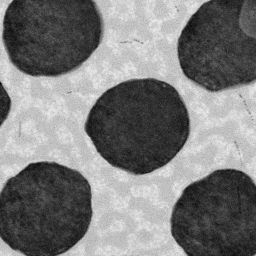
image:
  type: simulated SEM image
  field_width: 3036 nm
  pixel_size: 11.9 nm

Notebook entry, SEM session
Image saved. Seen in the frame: holes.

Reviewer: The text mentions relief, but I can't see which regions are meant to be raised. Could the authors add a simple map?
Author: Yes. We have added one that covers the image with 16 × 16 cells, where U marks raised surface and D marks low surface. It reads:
DDDDDDUUUUUUDDDD
DDDDDDUUUUUUDDDD
DDDDDDUUUUUDDDDD
UDDDDDUUUUUDDDDD
UDDDUUUUUUUDDDDD
UUUUUUUDDDDUUDUU
DUUUUUDDDDDDUUUU
UUUUUDDDDDDDUUUU
UUUUUUDDDDDDUUUU
UUUUUUDDDDDUUUUU
UUDDUUUDDDUUUUUU
DDDDDDUUUUUUDDDD
DDDDDDUUUUUDDDDD
DDDDDDUUUUUDDDDD
DDDDDUUUUUUDDDDD
UDDDUUUUUUUDDDDD